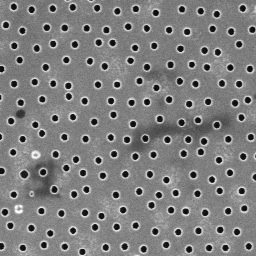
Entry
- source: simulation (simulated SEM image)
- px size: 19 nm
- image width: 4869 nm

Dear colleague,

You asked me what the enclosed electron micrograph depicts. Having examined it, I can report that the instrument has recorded a regular array of holes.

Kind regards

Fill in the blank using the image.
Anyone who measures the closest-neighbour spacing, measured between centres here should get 0.323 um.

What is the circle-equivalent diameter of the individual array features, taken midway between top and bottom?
125 nanometers